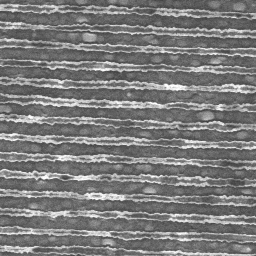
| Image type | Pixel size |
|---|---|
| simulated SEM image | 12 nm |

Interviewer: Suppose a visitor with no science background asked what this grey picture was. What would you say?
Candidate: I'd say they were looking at parallel lines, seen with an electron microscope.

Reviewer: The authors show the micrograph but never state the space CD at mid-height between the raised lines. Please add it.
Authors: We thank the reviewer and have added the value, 0.151 µm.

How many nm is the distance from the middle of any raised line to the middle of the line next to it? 223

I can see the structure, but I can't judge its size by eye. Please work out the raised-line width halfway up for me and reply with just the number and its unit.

71.9 nm